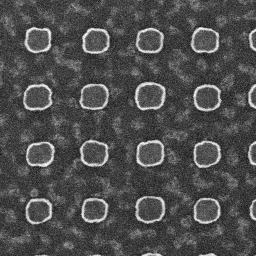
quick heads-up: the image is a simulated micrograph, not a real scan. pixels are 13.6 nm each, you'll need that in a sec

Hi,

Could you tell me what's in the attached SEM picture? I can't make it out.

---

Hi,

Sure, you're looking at a regular array of raised bodies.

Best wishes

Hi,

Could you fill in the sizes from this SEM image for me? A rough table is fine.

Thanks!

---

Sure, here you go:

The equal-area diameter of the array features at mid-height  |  356 nm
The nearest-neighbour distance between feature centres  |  758 nanometers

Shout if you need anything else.